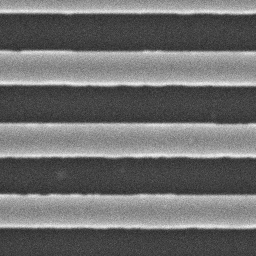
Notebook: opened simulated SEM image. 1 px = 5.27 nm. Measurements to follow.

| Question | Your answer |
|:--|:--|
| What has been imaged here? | lines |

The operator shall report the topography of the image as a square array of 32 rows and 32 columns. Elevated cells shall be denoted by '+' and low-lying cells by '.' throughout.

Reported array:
++++++++++++++++++++++++++++++++
++++++++++++++++++++++++++++++++
................................
................................
................................
................................
+++++++++.........+++...........
++++++++++++++++++++++++++++++++
++++++++++++++++++++++++++++++++
++++++++++++++++++++++++++++++++
++++++++++++++++++++++++++++++++
................................
................................
................................
................................
................................
++++++++++++++++++++++++++++++++
++++++++++++++++++++++++++++++++
++++++++++++++++++++++++++++++++
++++++++++++++++++++++++++++++++
................................
................................
................................
................................
++++++++++++++++++++++++++++++++
++++++++++++++++++++++++++++++++
++++++++++++++++++++++++++++++++
++++++++++++++++++++++++++++++++
................................
................................
................................
................................